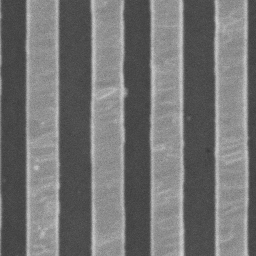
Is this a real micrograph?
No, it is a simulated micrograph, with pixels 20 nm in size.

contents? lines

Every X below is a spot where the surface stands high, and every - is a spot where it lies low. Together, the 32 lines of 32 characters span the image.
---XXXX-----XXX----XXXX----XXXX-
---XXXX-----XXX----XXXX----XXXX-
---XXXX-----XXX----XXXX----XXXX-
---XXXX-----XXX----XXXX----XXXX-
---XXXX-----XXX----XXXX----XXXX-
---XXXX-----XXX----XXXX----XXXX-
---XXXX-----XXX----XXXX----XXXX-
---XXXX-----XXX----XXXX----XXXX-
---XXXX-----XXX----XXXX----XXXX-
---XXXX-----XXX----XXXX----XXXX-
---XXXX-----XXX----XXXX----XXXX-
---XXXX-----XXX----XXXX----XXXX-
---XXXX-----XXX----XXXX----XXXX-
---XXXX-----XXX----XXXX----XXXX-
---XXXX-----XXX----XXXX----XXXX-
---XXXX-----XXX----XXXX----XXXX-
---XXXX-----XXXX---XXXX----XXXX-
---XXXX----XXXXX---XXXX----XXXX-
---XXXX----XXXX----XXXX----XXXX-
---XXXX----XXXX----XXXX----XXXX-
---XXXX-----XXX----XXXX----XXXX-
---XXXX-----XXX----XXXX----XXXX-
---XXXX-----XXX----XXXX----XXXX-
---XXXX-----XXX----XXXX----XXXX-
---XXXX-----XXX----XXXX----XXXX-
---XXXX-----XXX----XXXX----XXXX-
---XXXX-----XXXX---XXXX----XXXX-
---XXXX-----XXXX---XXXX----XXXX-
---XXXX-----XXXX---XXXX----XXXX-
---XXXX-----XXXX---XXXX----XXXX-
---XXXX-----XXXX---XXXX----XXXX-
---XXXX-----XXXX---XXXX----XXXX-